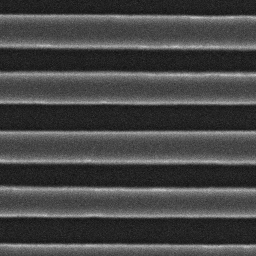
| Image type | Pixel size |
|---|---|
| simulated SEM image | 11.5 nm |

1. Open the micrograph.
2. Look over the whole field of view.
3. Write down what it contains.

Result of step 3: lines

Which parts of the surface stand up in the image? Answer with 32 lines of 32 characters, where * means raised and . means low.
................................
................................
********************************
********************************
********************************
********************************
................................
................................
................................
********************************
********************************
********************************
********************************
................................
................................
................................
................................
********************************
********************************
********************************
................................
................................
................................
................................
********************************
********************************
********************************
................................
................................
................................
................................
********************************